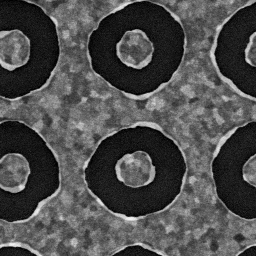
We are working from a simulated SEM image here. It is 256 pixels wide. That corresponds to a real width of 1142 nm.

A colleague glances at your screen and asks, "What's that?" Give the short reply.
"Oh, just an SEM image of ring-shaped grooves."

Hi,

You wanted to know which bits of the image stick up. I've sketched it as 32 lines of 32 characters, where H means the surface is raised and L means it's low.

LLLLHHHHHHHHHHHHLLLHHHHHHHHHHHHL
LLLLLLHHHHHHHHLLLLLLLHHHHHHHHHLL
LLLLLLLHHHHHHLLLLLLLLLHHHHHHLLLL
LLLLLLLHHHHHLLLLLLLLLLLHHHHHLLLL
HHHLLLLHHHHLLLLHHHLLLLLHHHHLLLLL
HHHHLLLHHHHLLLLHHHHLLLLHHHHLLLLH
HHHHLLLHHHHLLLLHHHHLLLLHHHHLLLLH
HHHLLLLHHHHLLLLHHHLLLLLHHHHLLLLH
LLLLLLLHHHHLLLLLLLLLLLHHHHHLLLLL
LLLLLLHHHHHHHLLLLLLLLLHHHHHHLLLL
LLLLLLHHHHHHHHLLLLLLLHHHHHHHHLLL
LLLLHHHHHHHHHHHHLLLHHHHHHHHHHHLL
HHHHHHHHHHHHHHHHHHHHHHHHHHHHHHHH
HHHHHHHHHHHHHHHHHHHHHHHHHHHHHHHH
HHHHHHHHHHHHHHHHHHHHHHHHHHHHHHHH
LLLHHHHHHHHHHHHHHHHHHHHHHHHHHHHL
LLLLLHHHHHHHHHHLLLLLHHHHHHHHHLLL
LLLLLLHHHHHHHLLLLLLLLLHHHHHHLLLL
LLLLLLHHHHHHLLLLLLLLLLHHHHHLLLLL
LHHLLLLHHHHLLLLLHHHLLLLHHHHLLLLL
HHHHLLLHHHHLLLLHHHHLLLLHHHLLLLLH
HHHHLLLHHHHLLLLHHHHLLLLHHHHLLLHH
HHHLLLLHHHHLLLLHHHHLLLLHHHHLLLLH
LHLLLLLHHHHLLLLLLLLLLLLHHHHLLLLL
LLLLLLLHHHHHLLLLLLLLLLHHHHHLLLLL
LLLLLHHHHHHHHLLLLLLLLHHHHHHHLLLL
LLLLLHHHHHHHHHLLLLLLHHHHHHHHHLLL
LLLHHHHHHHHHHHHHHHHHHHHHHHHHHHHH
HHHHHHHHHHHHHHHHHHHHHHHHHHHHHHHH
HHHHHHHHHHHHHHHHHHHHHHHHHHHHHHHH
HHHHHHHHHHHHHHHHHHHHHHHHHHHHHHHH
LLLLHHHHHHHHHHHLLLLLHHHHHHHHHHLL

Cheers